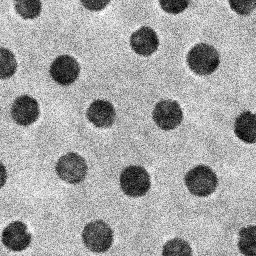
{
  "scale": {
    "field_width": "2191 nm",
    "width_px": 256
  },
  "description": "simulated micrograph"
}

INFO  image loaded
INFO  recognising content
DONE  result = a regular array of holes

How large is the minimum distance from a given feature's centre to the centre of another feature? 529 nm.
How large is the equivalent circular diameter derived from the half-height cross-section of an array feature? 0.283 micrometres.